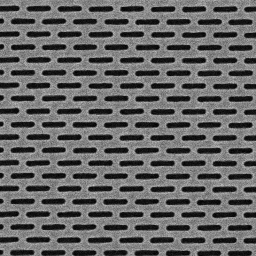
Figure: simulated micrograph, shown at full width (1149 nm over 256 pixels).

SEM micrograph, a regular array of holes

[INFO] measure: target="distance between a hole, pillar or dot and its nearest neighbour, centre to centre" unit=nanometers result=87.7